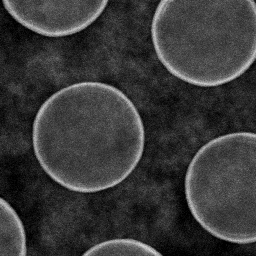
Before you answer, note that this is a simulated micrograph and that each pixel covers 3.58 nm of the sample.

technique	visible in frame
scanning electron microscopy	raised bodies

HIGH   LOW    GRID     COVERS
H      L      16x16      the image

LHHHHHLLLLHHHHHH
LHHHHLLLLLHHHHHH
LLLLLLLLLLHHHHHH
LLLLLLLLLLHHHHHH
LLLLLLLLLLLHHHHL
LLLLHHHLLLLLLLLL
LLLHHHHHLLLLLLLL
LLHHHHHHHLLLLLLL
LLHHHHHHHLLLLLHH
LLHHHHHHHLLLHHHH
LLLHHHHHLLLLHHHH
LLLLHHHLLLLLHHHH
LLLLLLLLLLLLHHHH
HLLLLLLLLLLLHHHH
HLLLLLLLLLLLLHHH
HHLLLLHHHLLLLLLL